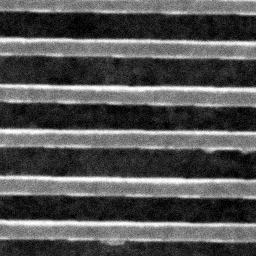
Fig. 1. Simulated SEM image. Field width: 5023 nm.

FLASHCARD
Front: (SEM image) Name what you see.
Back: lines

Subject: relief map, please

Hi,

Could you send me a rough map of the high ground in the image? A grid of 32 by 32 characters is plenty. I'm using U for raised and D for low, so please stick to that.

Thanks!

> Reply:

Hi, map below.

UUUUUUUUUUUUUUUUUUUUUUUUUUUUUUUU
DDDDDDDDDDDDUUUUUUUUUUUUUUUUUUUU
DDDDDDDDDDDDDDDDDDDDDDDDDDDDDDDD
DDDDDDDDDDDDDDDDDDDDDDDDDDDDDDDD
DDDDDDDDDDDDDDDDDDDDDDDDDDDDDDDD
UUUUUUUUUUUUUUUUUUUUUUUUUUUUUUUU
UUUUUUUUUUUUUUUUUUUUUUUUUUUUUUUU
DDDDDDDDDDDDDDDDDDDDDDDDDDDDDDDD
DDDDDDDDDDDDDDDDDDDDDDDDDDDDDDDD
DDDDDDDDDDDDDDDDDDDDDDDDDDDDDDDD
DDDDDDDDDDDDDDDDDDDDDDDDDDDDDDDD
UUUUUUUUUUUUUUUUUUUUUUUUUUUUUUUU
UUUUUUUUUUUUUUUUUUUUUUUUUUUUUUUU
DDDDDDDDDDDDDDDDDDDDDDDDDDDDDDDD
DDDDDDDDDDDDDDDDDDDDDDDDDDDDDDDD
DDDDDDDDDDDDDDDDDDDDDDDDDDDDDDDD
UUUUUUUUUUUUUUUUUUUUUUUUUUDUDDDD
UUUUUUUUUUUUUUUUUUUUUUUUUUUUUUUU
DDDDDDDDDDDDDDDDDDDDDDDDDDUUUUUU
DDDDDDDDDDDDDDDDDDDDDDDDDDDDDDDD
DDDDDDDDDDDDDDDDDDDDDDDDDDDDDDDD
DDDDDDDDDDDDDDDDDDDDDDDDDDDDDDDD
UUUUUUUUUUUUUUUUUUUUUUUUUUUUUUDD
UUUUUUUUUUUUUUUUUUUUUUUUUUUUUUUU
DDDDDDDDDDDDDDDUUUUUUUUUUUUUUUUU
DDDDDDDDDDDDDDDDDDDDDDDDDDDDDDDD
DDDDDDDDDDDDDDDDDDDDDDDDDDDDDDDD
DDDDDDDDDDDDDDDDDDDDDDDDDDDDDDDD
UUUUUUUUUUUUUUUUUUUUUUUUUUUUUUUU
UUUUUUUUUUUUUUUUUUUUUUUUUUUUUUUU
DDDDDDDDDDDDDDDDDDDDDDDDDDDDDDDD
DDDDDDDDDDDDDDDDDDDDDDDDDDDDDDDD